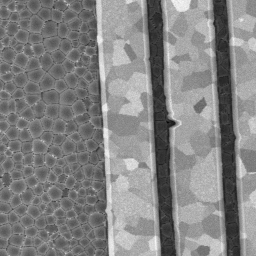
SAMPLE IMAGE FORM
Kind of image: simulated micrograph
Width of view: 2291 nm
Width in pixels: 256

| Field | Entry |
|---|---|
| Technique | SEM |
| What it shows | one or a few lines or trenches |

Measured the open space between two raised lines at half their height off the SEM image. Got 0.169 um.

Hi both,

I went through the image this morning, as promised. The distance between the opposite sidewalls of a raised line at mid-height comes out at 410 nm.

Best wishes